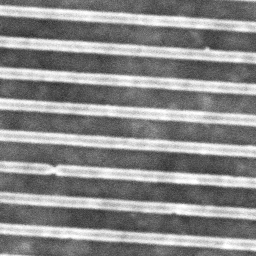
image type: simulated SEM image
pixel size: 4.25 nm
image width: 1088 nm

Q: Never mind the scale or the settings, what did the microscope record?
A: parallel lines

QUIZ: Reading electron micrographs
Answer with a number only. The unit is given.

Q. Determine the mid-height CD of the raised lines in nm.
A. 35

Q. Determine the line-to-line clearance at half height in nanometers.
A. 97.5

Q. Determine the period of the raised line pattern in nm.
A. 132